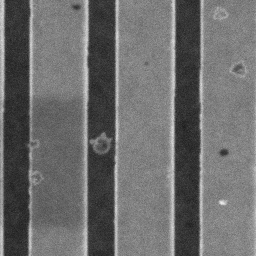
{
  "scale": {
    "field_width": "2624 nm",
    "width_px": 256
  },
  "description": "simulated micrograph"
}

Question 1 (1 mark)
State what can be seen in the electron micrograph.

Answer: lines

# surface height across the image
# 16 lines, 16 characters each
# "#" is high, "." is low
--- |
..###..####..###
..###..####..###
..###..####..###
..###..####..###
..###..####..###
..###..####..###
..###..####..###
..###..####..###
..###..####..###
..###..####..###
..###..####..###
..###..####..###
..###..####..###
..###..####..###
..###..####..###
..###..####..###